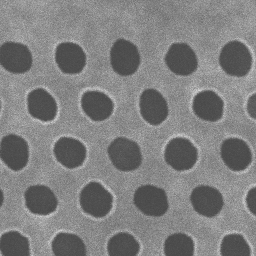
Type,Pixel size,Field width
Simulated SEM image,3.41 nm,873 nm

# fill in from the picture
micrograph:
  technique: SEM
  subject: a regular array of holes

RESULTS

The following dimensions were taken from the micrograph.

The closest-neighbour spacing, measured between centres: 185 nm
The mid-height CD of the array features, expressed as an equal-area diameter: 109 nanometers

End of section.